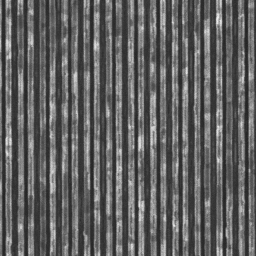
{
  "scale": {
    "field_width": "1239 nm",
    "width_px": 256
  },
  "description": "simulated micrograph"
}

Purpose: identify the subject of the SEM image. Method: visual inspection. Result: parallel lines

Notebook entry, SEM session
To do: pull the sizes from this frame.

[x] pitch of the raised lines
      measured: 53.5 nanometres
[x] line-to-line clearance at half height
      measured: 24.2 nm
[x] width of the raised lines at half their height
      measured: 24.2 nm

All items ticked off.